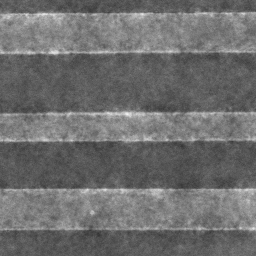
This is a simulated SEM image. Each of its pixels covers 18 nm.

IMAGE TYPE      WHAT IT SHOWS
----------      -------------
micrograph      lines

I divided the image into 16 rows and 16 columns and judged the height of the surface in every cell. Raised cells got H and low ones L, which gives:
LLLLLLLLLLLLLLLL
HHHHHHHHHHHHHHHH
HHHHHHHHHHHHHHHH
LLLLLLLLLLLLLLLL
LLLLLLLLLLLLLLLL
LLLLLLLLLLLLLLLL
LLLLLLLLLLLLLLLL
HHHHHHHHHHHHHHHH
HHHHHHHHHHHHHHHH
LLLLLLLLLLLLLLLL
LLLLLLLLLLLLLLLL
LLLLLLLLLLLLLLLL
HHHHHHHHHHHHHHHH
HHHHHHHHHHHHHHHH
LLLLLLLLLLLLLLLL
LLLLLLLLLLLLLLLL